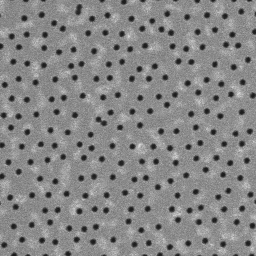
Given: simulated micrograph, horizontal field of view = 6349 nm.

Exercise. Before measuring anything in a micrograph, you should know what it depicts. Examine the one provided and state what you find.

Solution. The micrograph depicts a regular array of holes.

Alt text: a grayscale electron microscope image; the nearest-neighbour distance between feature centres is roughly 0.363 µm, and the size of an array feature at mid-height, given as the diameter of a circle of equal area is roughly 166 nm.